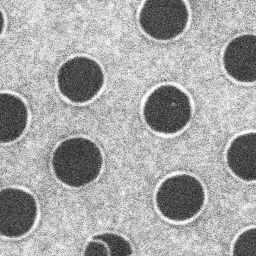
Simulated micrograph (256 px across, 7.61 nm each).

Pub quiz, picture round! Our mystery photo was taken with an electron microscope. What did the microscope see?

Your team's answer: raised bodies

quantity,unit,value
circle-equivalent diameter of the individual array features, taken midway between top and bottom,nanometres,398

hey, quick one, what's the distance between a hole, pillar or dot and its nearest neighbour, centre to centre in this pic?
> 652 nanometres